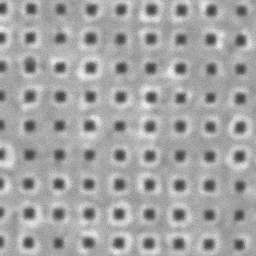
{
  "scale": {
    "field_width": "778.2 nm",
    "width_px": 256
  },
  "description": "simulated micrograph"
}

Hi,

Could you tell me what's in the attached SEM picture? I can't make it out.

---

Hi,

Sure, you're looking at a regular array of holes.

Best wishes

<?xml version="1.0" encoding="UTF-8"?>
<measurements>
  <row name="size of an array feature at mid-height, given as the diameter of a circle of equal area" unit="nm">36.5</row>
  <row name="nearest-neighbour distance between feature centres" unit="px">29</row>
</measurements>